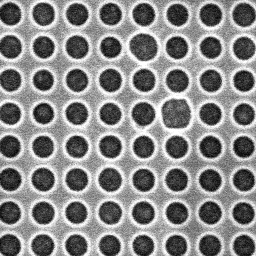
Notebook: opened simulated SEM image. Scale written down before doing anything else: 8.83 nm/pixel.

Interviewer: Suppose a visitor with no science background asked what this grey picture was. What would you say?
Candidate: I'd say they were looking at a regular array of holes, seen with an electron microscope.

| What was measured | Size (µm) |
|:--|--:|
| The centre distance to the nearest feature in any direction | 0.29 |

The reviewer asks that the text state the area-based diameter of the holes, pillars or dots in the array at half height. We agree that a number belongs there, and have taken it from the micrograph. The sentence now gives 208 nanometers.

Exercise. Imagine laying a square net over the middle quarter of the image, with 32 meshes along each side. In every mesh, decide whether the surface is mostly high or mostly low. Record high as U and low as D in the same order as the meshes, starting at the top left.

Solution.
UUUUUUUUUUUUUUUUUUUUUUUUUUUUUUUU
UUDDDUUUUUDDDUUUUUDDDDUUUUUDDDUU
UDDDDUUUUDDDDDUUUDDDDDUUUUDDDDDU
DDDDDDUUUDDDDDUUUDDDDDDUUUDDDDDU
DDDDDDUUUDDDDDDUUDDDDDDUUDDDDDDU
UDDDDDUUUDDDDDUUUDDDDDDUUUDDDDDU
UDDDDUUUUUDDDUUUUUDDDDUUUUDDDDUU
UUUUUUUUUUUUUUUUUUUUUUUUUUUUUUUU
UUUUUUUUUUUUUUUUUUUUUUUUUUUUUUUU
UUDDUUUUUUUDUUUUUUUDDUUUUDDDDDDU
UDDDDUUUUDDDDUUUUDDDDDUUDDDDDDDU
DDDDDDUUUDDDDDUUUDDDDDDUDDDDDDDD
DDDDDDUUUDDDDDUUUDDDDDDUDDDDDDDD
DDDDDDUUUDDDDDUUUDDDDDDUDDDDDDDD
UDDDDUUUUDDDDDUUUUDDDDUUUDDDDDDU
UUUDUUUUUUUDUUUUUUUDDUUUUDDDDDDU
UUUUUUUUUUUUUUUUUUUUUUUUUUUUDUUU
UUUUUUUUUUUUUUUUUUUUUUUUUUUUUUUU
UDDDDUUUUDDDDDUUUUDDDDUUUUDDDDUU
DDDDDDUUUDDDDDUUUDDDDDUUUDDDDDDU
DDDDDDUUDDDDDDDUUDDDDDDUUDDDDDDU
DDDDDDUUUDDDDDUUUDDDDDDUUDDDDDDU
UDDDDDUUUDDDDDUUUUDDDDUUUUDDDDDU
UUDDDUUUUUDDDUUUUUUDDUUUUUUDDUUU
UUUUUUUUUUUUUUUUUUUUUUUUUUUUUUUU
UUUUUUUUUUUUUUUUUUUUUUUUUUUUUUUU
UDDDDUUUUDDDDUUUUUDDDUUUUUDDDDUU
DDDDDDUUUDDDDDUUUDDDDDUUUDDDDDDU
DDDDDDUUDDDDDDDUUDDDDDDUUDDDDDDU
DDDDDDUUDDDDDDDUUDDDDDDUUDDDDDDU
UDDDDDUUUDDDDDUUUDDDDDDUUUDDDDDU
UUDDDUUUUUDDDUUUUUDDDDUUUUUDDDUU